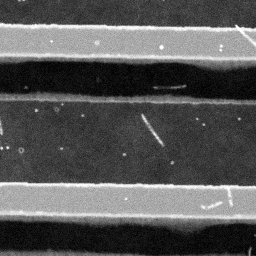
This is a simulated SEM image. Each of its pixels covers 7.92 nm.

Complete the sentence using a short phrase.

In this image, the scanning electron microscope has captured lines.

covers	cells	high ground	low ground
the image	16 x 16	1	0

1111111111111111
1111111111111111
1111111111111111
1111111111111111
0000000000000000
0000000000000000
1111111111111111
1111111111111111
1111111111111111
1111111111111111
1111111111111111
1111111111111111
1111111111111111
0001111111111111
0000000000000000
0000000000000000